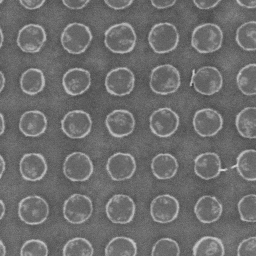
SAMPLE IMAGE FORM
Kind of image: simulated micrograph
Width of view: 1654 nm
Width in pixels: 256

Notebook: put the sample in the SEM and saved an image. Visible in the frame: a regular array of raised bodies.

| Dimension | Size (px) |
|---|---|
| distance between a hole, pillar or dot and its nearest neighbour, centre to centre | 42.5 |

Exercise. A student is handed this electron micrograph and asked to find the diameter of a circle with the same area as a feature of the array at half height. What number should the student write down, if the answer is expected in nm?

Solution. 178